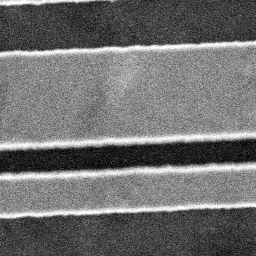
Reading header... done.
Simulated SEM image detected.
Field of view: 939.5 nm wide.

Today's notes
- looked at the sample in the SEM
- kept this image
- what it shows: lines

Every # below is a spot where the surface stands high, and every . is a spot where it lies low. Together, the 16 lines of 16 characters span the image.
................
................
................
################
################
################
################
################
###############.
................
.............###
################
################
#...............
................
................